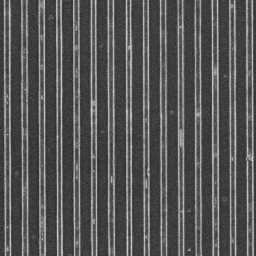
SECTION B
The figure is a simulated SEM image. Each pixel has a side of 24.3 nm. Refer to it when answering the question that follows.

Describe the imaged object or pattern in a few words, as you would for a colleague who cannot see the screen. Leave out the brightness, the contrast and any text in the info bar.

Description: parallel lines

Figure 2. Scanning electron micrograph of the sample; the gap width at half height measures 294 nm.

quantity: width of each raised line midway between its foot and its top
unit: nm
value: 136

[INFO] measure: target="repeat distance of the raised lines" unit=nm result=420